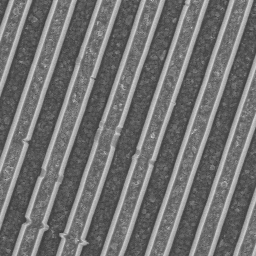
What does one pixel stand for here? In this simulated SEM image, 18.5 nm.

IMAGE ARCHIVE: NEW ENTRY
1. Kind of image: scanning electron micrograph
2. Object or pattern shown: parallel lines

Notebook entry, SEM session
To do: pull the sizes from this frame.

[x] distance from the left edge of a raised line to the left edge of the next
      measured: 776 nm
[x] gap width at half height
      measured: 442 nm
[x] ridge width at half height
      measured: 0.332 micrometres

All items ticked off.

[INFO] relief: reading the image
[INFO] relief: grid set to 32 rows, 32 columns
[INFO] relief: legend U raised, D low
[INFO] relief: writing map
DUUUDDDUUDDDUUUDDDUUDDDUUUDDDUUD
DUUDDDUUUDDDUUDDDUUUDDDUUDDDDUUD
DUUDDDUUDDDDUUDDDUUDDDDUUDDDUUUD
UUUDDDUUDDDUUUDDDUUDDDUUUDDDUUDD
UUDDDUUUDDDUUDDDUUUDDDUUDDDDUUDD
UUDDDUUDDDDUUDDDUUDDDDUUDDDUUUDD
UUDDDUUDDDUUUDDDUUDDDUUUDDDUUDDD
UDDDUUUDDDUUDDDUUUDDDUUDDDDUUDDD
UDDDUUDDDDUUDDDUUDDDDUUDDDUUUDDD
UDDDUUDDDUUUDDDUUDDDUUUDDDUUDDDU
DDDUUUDDDUUDDDUUUDDDUUDDDDUUDDDU
DDDUUDDDDUUDDDUUDDDDUUDDDUUUDDDU
DDDUUDDDUUUDDDUUDDDUUUDDDUUDDDUU
DDUUUDDDUUDDDUUUDDDUUDDDDUUDDDUU
DDUUDDDDUUDDDUUDDDDUUDDDUUUDDDUU
DDUUDDDUUUDDDUUDDDUUUDDDUUDDDUUU
DUUUDDDUUDDDUUUDDDUUDDDDUUDDDUUD
DUUDDDDUUDDDUUDDDDUUDDDUUUDDDUUD
DUUDDDUUUDDDUUDDDUUUDDDUUDDDUUUD
UUUDDDUUDDDUUUDDDUUDDDDUUDDDUUDD
UUDDDDUUDDDUUDDDDUUDDDUUUDDDUUDD
UUDDDUUUDDDUUDDDUUUDDDUUDDDUUUDD
UUDDDUUDDDUUUDDDUUDDDDUUDDDUUDDD
UDDDDUUDDDUUDDDDUUDDDUUUDDDUUDDD
UDDDUUUDDDUUDDDUUUDDDUUDDDUUUDDD
UDDDUUDDDUUUDDDUUDDDDUUDDDUUDDDD
DDDDUUDDDUUDDDDUUDDDUUUDDDUUDDDU
DDDDUUDDDUUDDDUUUDDDUUDDDUUUDDDU
DDDUUUDDUUUDDDUUDDDDUUDDDUUDDDDU
DDDUUDDDUUDDDDUUDDDUUUDDDUUDDDUU
DDUUUDDDUUDDDUUUDDDUUDDDUUUDDDUU
DDUUDDDUUUDDDUUDDDDUUDDDUUDDDDUU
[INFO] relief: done